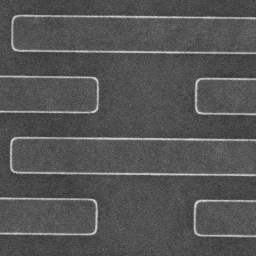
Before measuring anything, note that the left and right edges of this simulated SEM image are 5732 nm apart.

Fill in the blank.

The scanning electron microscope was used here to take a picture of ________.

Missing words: groups of lines, slits or small figures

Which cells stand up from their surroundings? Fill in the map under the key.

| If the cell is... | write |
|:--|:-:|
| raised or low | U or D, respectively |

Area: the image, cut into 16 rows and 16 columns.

DDDDDDDDDDDDDDDD
DUUUUUUUUUUUUUUU
DUUUUUUUUUUUUUUU
DDDDDDDDDDDDDDDD
DDDDDDDDDDDDDDDD
UUUUUUDDDDDDUUUU
UUUUUUDDDDDDUUUU
DDDDDDDDDDDDDDDD
DDDDDDDDDDDDDDDD
DUUUUUUUUUUUUUUU
DUUUUUUUUUUUUUUU
DDDDDDDDDDDDDDDD
UUUUUUDDDDDDDDDD
UUUUUUDDDDDDUUUU
UUUUUUDDDDDDUUUU
DDDDDDDDDDDDDDDD